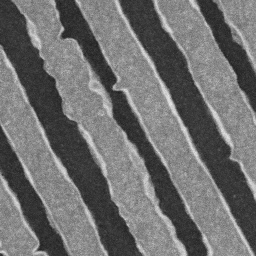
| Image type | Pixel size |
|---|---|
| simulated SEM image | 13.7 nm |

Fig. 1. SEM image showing one or a few lines or trenches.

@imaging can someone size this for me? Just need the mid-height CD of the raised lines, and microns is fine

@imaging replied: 0.466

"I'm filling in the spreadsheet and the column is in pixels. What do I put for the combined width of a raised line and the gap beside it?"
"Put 62.7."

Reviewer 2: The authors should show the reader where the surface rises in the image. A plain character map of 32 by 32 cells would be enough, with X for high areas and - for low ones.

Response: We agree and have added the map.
--XXXXX---XXXXX----XXXXX----XXXX
---XXXX---XXXXX-----XXXXX---XXXX
----XXX----XXXXX----XXXXXX--XXXX
----XXXX---XXXXX-----XXXXX---XXX
----XXX-----XXXXX----XXXXXX---XX
-----XXXXX--XXXXX-----XXXXX----X
X----XXXXX---XXXXX-----XXXXX---X
X----XXXXXX--XXXXXX----XXXXX---X
XX----XXXXX---XXXXX-----XXXXX---
XX----XXXXX----XXXXX----XXXXXX--
XX-----XXXXX--XXXXXX-----XXXXX--
XXX----XXXXXX---XXXXX----XXXXX--
XXX-----XXXXX---XXXXX-----XXXXX-
XXXX----XXXXX----XXXXX----XXXXX-
XXXXX---XXXXXX---XXXXX-----XXXXX
XXXXX-----XXXXX---XXXXX----XXXXX
-XXXX------XXXX---XXXXX-----XXXX
-XXXXX-----XXXXX---XXXXX-----XXX
--XXXX------XXXX----XXXX-----XXX
--XXXXX-----XXXXX---XXXXX----XXX
---XXXX------XXXXX---XXXX-----XX
---XXXXX-----XXXXX---XXXXX----XX
----XXXXX----XXXXX----XXXX-----X
X---XXXXXX----XXXX----XXXXX-----
XX---XXXXX----XXXXX----XXXXX----
XX----XXXXX---XXXXX----XXXXX----
XXX---XXXXX----XXXXX----XXXXX---
XXX----XXXXX----XXXXX---XXXXX---
XXXX---XXXXX----XXXXX----XXXXX--
XXXX----XXXX-----XXXXX---XXXXX--
XXXXX---XXXXX----XXXXX----XXXXX-
XXXXX----XXXX-----XXXXX---XXXXX-